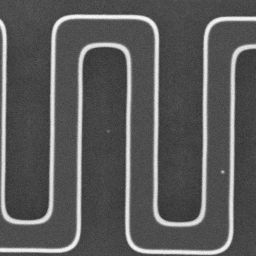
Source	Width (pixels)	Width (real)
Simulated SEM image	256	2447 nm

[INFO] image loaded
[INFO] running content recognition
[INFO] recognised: groups of lines, slits or small figures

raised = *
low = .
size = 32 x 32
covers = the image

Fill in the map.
................................
................................
........**********.........*****
.......************.......******
*......*************......******
*......*************......******
*......****.....****......****..
*......***......****......***...
*......***......****......***...
.......***......****......***...
.......***......****......***...
.......***......****......***...
.......***......***.......***...
.......***......***.......***...
.......***......***.......***...
.......***......***.......***...
......****......***.......***...
......****......***.......***...
......****......***.......***...
......****......***.......***...
......****......***.......***...
......****......***.......***...
......****......***.......***...
......****......***.......***...
......****......***.......***...
......****......***......****...
*.....****......****.....****...
*....*****......****.....****...
**********......*************...
**********......*************...
*********.......************....
......................*****.....